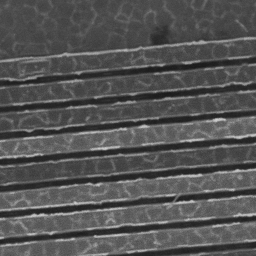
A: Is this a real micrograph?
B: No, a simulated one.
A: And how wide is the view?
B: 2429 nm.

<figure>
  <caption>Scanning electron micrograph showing parallel lines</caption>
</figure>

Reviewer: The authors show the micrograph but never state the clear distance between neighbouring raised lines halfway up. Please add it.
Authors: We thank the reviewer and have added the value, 0.0709 micrometres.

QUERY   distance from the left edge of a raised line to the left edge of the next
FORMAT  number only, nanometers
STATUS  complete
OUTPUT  248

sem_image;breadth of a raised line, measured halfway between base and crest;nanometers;178